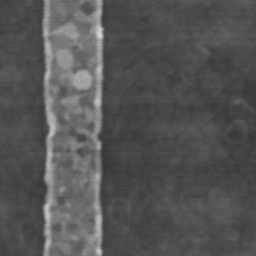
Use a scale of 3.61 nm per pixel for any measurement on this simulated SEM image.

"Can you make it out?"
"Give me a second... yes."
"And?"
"one or a few lines or trenches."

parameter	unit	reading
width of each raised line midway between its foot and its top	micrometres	0.187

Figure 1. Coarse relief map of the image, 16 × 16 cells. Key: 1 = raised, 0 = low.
0001110000000000
0001110000000000
0001110000000000
0001110000000000
0001110000000000
0001110000000000
0001110000000000
0001110000000000
0001110000000000
0001110000000000
0001110000000000
0001110000000000
0001110000000000
0001110000000000
0001110000000000
0001110000000000